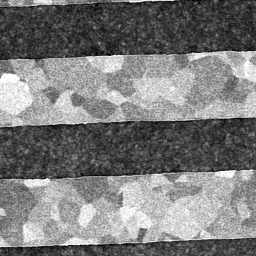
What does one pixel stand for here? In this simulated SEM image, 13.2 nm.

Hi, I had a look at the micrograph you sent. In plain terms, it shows one or a few lines or trenches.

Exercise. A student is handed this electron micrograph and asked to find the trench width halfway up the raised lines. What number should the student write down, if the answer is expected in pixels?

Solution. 53.7